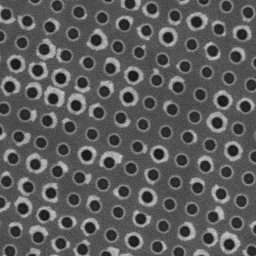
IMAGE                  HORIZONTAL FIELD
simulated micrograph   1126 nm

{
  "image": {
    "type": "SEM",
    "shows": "a regular array of holes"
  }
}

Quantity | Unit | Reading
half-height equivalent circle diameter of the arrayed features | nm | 51.6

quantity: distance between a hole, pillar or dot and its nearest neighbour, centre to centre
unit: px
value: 22.3